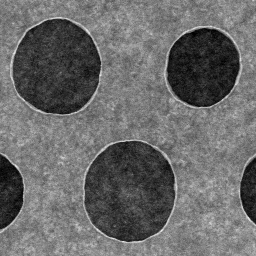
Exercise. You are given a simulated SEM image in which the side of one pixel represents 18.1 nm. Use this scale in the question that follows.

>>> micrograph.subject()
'holes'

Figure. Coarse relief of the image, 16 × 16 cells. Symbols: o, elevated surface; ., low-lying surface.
oooooooooooooooo
oo...ooooooooooo
o.....ooooo...oo
o.....ooooo....o
o.....oooo.....o
o.....ooooo....o
oo...ooooooo.ooo
oooooooooooooooo
oooooooooooooooo
oooooo....oooooo
.ooooo.....oooo.
.oooo......oooo.
.oooo......oooo.
.ooooo.....ooooo
oooooo....oooooo
oooooooooooooooo